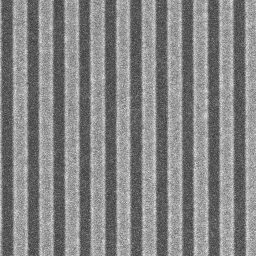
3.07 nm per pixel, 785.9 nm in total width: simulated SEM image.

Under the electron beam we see parallel lines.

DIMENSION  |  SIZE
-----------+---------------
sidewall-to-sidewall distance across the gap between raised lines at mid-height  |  40.3 nm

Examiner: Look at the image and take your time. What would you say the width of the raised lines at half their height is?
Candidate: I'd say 0.0376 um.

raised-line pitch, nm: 79.2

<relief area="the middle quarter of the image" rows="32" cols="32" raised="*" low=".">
****...***...***....***...***...
****...***...***....***...***...
****...***...***....***...***...
****...***...***....***...***...
****...***...***....***...***...
****...***...***....***...***...
****...***...***....***...***...
****...***...***....***...***...
****...***...***....***...***...
****...***...***....***...***...
****...***...***....***...***...
****...***...***....***...***...
****...***...***....***...***...
****...***...***....***...***...
****...***...***....***...***...
****...***...***....***...***...
****...***...***....***...***...
****...***...***....***...***...
****...***...***....***...***...
****...***...***....***...***...
****...***...***....***...***...
****...***...***....***...***...
****...***...***....***...***...
****...***...***....***...***...
****...***...***....***...***...
****...***...***....***...***...
****...***...***....***...***...
****...***...***....***...***...
****...***...***....***...***...
****...***...***....***...***...
****...***...***....***...***...
****...***...***....***...***...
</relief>